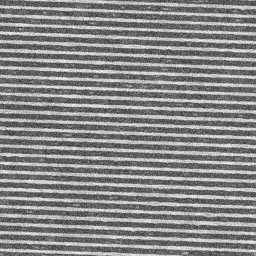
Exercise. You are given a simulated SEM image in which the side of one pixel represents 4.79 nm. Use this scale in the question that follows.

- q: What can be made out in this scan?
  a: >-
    parallel lines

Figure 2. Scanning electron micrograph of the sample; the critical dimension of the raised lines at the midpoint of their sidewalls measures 12.6 nm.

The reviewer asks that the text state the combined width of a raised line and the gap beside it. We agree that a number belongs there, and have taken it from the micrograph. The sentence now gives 41.5 nm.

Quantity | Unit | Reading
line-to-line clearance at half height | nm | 29.3